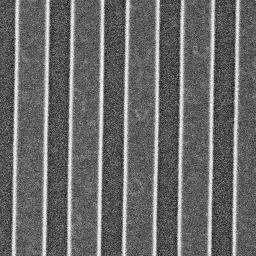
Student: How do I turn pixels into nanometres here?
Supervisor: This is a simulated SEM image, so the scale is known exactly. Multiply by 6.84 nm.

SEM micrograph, parallel lines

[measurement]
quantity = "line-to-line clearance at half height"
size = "0.163 micrometres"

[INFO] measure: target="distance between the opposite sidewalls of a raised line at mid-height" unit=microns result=0.214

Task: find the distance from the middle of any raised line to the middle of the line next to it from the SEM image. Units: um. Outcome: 0.377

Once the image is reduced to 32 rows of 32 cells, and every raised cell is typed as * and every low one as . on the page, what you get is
..****...****...****...****...**
..****...****...****...****...**
..****...****...****...****...**
..****...****...****...****...**
..****...****...****...****...**
..****...****...****...****...**
..****...****...****...****...**
..****...****...****...****...**
..****...****...****...****...**
..****...****...****...****...**
..****...****...****...***....**
..****...****...****...***....**
..****...****...****...***....**
..****...****...****...***....**
..****...****...****...***....**
..****...****...****...***....**
..****...****...****...***....**
..****...****...****...***...***
..****...****...***....***...***
..****...****...***....***...***
..****...***....***....***...***
..****...***....***....***...***
..****...***....***....***...***
..****...***....***....***...***
..****...***....***....***...***
..****...***....***...****...***
..****...***....***...****...***
..****...***....***...****...***
..****...***....***...****...***
..****...***....***...****...***
..****...***....***...****...***
..****...***....***...****...***